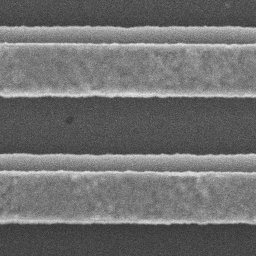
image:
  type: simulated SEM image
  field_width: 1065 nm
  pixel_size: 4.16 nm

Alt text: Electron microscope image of lines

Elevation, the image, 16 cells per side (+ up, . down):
................
................
................
++++++++++++++++
++++++++++++++++
++++++++++++++++
................
................
................
................
................
++++++++++++++++
++++++++++++++++
++++++++++++++++
................
................